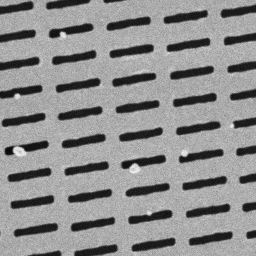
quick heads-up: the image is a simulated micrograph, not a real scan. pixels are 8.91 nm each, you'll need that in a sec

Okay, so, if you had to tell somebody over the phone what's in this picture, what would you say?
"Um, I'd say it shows a regular array of holes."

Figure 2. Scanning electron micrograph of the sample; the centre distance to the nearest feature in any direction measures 246 nm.